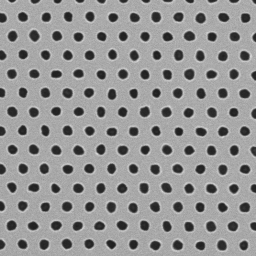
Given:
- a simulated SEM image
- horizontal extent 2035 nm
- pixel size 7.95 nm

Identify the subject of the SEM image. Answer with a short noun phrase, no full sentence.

a regular array of holes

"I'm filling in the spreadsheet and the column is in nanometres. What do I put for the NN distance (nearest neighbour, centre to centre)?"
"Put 170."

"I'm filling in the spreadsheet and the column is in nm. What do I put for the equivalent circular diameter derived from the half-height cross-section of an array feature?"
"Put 77.6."